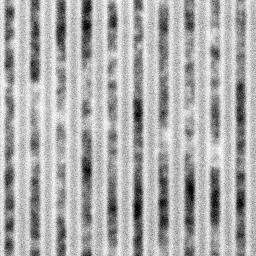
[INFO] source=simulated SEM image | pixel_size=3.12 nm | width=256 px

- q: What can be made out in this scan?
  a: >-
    parallel lines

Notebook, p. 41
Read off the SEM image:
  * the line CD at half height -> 44.8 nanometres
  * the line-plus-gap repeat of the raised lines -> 80.1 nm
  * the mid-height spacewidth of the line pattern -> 35.8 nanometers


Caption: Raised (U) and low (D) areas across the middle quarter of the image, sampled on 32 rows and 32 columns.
DUUUDDDUUUUDDDUUUDDDUUUDDDDUUUDD
DUUUDDDUUUUDDDUUUDDDUUUDDDDUUUDD
DUUUDDDUUUUDDDUUUDDDUUUDDDDUUUDD
DUUUDDDUUUUDDDUUUDDDUUUDDDDUUUDD
DUUUDDDUUUUDDDUUUDDDUUUDDDDUUUDD
DUUUDDDUUUUDDDUUUDDDUUUDDDDUUUDD
DUUUDDDUUUUDDDUUUDDDUUUDDDDUUUDD
DUUUDDDUUUUDDDUUUDDDUUUDDDDUUUDD
DUUUDDDUUUUDDDUUUDDDUUUDDDDUUUDD
DUUUDDDUUUUDDDUUUDDDUUUDDDDUUUDD
DUUUDDDUUUUDDDUUUDDDUUUDDDDUUUDD
DUUUDDDUUUUDDDUUUDDDUUUDDDDUUUDD
DUUUDDDUUUUDDDUUUDDDUUUDDDDUUUDD
DUUUDDDUUUUDDDUUUDDDUUUDDDDUUUDD
DUUUDDDUUUUDDDUUUDDDUUUDDDDUUUDD
DUUUDDDUUUUDDDUUUDDDUUUDDDDUUUDD
DUUUDDDUUUUDDDUUUDDDUUUDDDDUUUDD
DUUUDDDUUUUDDDUUUDDDUUUDDDDUUUDD
DUUUDDDUUUUDDDUUUDDDUUUDDDDUUUDD
DUUUDDDUUUUDDDUUUDDDUUUDDDDUUUDD
DUUUDDDUUUUDDDUUUDDDUUUDDDDUUUDD
DUUUDDDUUUUDDDUUUDDDUUUDDDDUUUDD
DUUUDDDUUUUDDDUUUDDDUUUDDDDUUUDD
DUUUDDDUUUUDDDUUUDDDUUUDDDDUUUDD
DUUUDDDUUUUDDDUUUDDDUUUDDDDUUUDD
DUUUDDDUUUUDDDUUUDDDUUUDDDDUUUDD
DUUUDDDUUUUDDDUUUDDDUUUDDDDUUUDD
DUUUDDDUUUUDDDUUUDDDUUUDDDDUUUDD
DUUUDDDUUUUDDDUUUDDDUUUDDDDUUUDD
DUUUDDDUUUUDDDUUUDDDUUUDDDDUUUDD
DUUUDDDUUUUDDDUUUDDDUUUDDDDUUUDD
DUUUDDDUUUUDDDUUUDDDUUUDDDDUUUDD